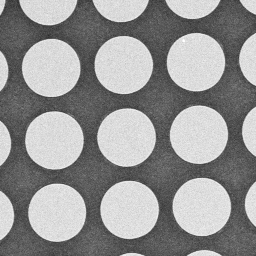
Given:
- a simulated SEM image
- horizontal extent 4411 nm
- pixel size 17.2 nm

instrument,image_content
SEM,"an array of small figures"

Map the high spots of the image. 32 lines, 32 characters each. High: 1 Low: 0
10011111110011111100011111100011
00011111100011111100001111000001
00001111000000110000000000000000
00000000000000000000000000000000
00000000000000000000000111000001
00001111000001111100001111100001
00011111100011111110011111110011
10011111110011111110011111110011
10011111110011111110011111110011
10011111110011111110011111110001
10011111100001111100001111100000
00001111000000111000000000000000
00000000000000000000000000000000
00000000000000000000000011000000
00000111100001111100001111110001
00001111110001111110001111110011
10011111110011111110011111110011
10011111110011111110011111110011
10011111110011111110001111110001
10001111110001111110001111100000
00000111100000111000000000000000
00000000000000000000000000000000
00000000000000000000000011000000
00000111100000111110000111110001
10001111110001111110001111111001
10001111111001111111001111111001
11001111111001111111001111111001
11001111111001111111001111110001
10001111110001111110000111110000
10000111100000011100000000000000
00000000000000000000000000000000
00000000000000000000000011100000